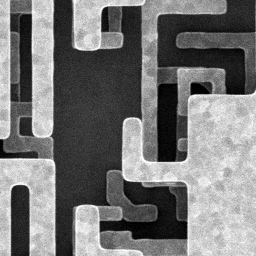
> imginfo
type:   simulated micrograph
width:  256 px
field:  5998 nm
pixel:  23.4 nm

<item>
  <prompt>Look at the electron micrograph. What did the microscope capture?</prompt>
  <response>wiring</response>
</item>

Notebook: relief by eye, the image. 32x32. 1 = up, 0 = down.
11111110011111111111111111110000
11111110011110000011111111110000
10001110011110000011000000000000
10001110011110000011000000000000
11001110011111100011000000000000
11001110011111100011000000000000
11001110000000000011000000000000
11001110000000000011000000000000
11001110000000000011000000000000
11001110000000000011001111110000
11001110000000000011001100110000
10001110000000000011001100010000
10001110000000000011001111111111
11111110000000000011001111111111
11111110000000000011000111111111
11001110000000011111000011111111
11001100000000011111000011111111
11111110000000011111001111111111
01111110000000011111001111111111
00000110000000011111000111111111
11111110000000011111111111111111
11111110000000011111111111111111
11111110000000001111111111111111
11001110000000000000000111111111
10001110000000000000000011111111
10001110000000000000000011111111
10001110011111100000000011111111
10001110011110000000000011111111
10001110011100000000000111111111
10001110011111111000000111111111
10001110011111111111111111111111
10001110011111111111111111111111